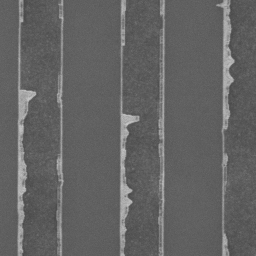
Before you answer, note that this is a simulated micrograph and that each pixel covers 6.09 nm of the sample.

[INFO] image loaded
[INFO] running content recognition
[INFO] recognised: one or a few lines or trenches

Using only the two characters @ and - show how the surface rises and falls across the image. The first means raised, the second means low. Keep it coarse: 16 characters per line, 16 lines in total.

-@@@----@@----@@
-@@@----@@----@@
-@@@----@@----@@
-@@@----@@----@@
-@@@----@@----@@
-@@@----@@----@@
-@@@----@@----@@
-@@@----@@----@@
-@@@----@@----@@
-@@@----@@----@@
-@@@----@@----@@
-@@@----@@----@@
-@@@----@@----@@
-@@@----@@----@@
-@@@----@@----@@
-@@@----@@----@@